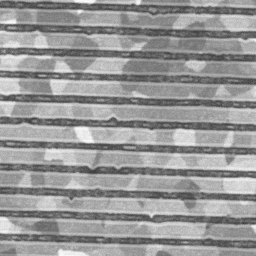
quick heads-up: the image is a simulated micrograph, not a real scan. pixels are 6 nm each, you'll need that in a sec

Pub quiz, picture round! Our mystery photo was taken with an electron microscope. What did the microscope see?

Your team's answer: parallel lines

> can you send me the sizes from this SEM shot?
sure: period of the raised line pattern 0.14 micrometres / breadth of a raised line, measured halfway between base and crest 84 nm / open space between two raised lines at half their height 55.5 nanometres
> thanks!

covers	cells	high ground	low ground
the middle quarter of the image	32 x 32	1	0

11111111111111111111111111111111
11111111111111111111111111111111
00000000000000000011000000111000
00000000000000000000000000000000
11011111000000000000000000000000
11111111111111111111111111111111
11111111111111111111111111111111
11111111111111111111111111111111
00000000000000000000000001011100
00000000000000000000000000000000
11111111111001000000000000000000
11111111111111111111111111111111
11111111111111111111111111111111
00001011111001111111111111111111
00000000000000000000000000000000
00000000000000000000000000000000
11111111111111111111100000011000
11111111111111111111111111111111
11111111111111111111111111111111
00000011100111111111111111111111
00000000000000000000000000000000
01000000000000000000000000000000
11111111111111111111110000000000
11111111111111111111111111111111
11111111111111111111111111111111
00000011000011100001111111111111
00000000000000000000000000000000
10000000000000000000000000000000
11111111111111111111111111111111
11111111111111111111111111111111
11111111111111111111111111111111
00000000000000000000000111111111